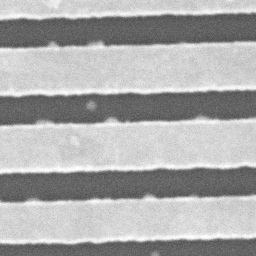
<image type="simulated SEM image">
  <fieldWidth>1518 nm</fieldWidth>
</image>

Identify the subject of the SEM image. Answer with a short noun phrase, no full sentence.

lines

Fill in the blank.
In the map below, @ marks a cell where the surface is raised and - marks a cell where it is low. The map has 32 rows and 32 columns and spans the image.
@@@@@@@@@@@@@@@@@@@@@@@@@@@@@@@@
@@@@@@@@@@@@@@@@@@@@@@@@@@@@@@--
--------------------------------
--------------------------------
--------------------------------
-------------------------@@@@@@@
@@@@@@@@@@@@@@@@@@@@@@@@@@@@@@@@
@@@@@@@@@@@@@@@@@@@@@@@@@@@@@@@@
@@@@@@@@@@@@@@@@@@@@@@@@@@@@@@@@
@@@@@@@@@@@@@@@@@@@@@@@@@@@@@@@@
@@@@@@@@@@@@@@@@@@@@@@@@@@@@@@@@
@@@@@@@@@@@@@@@@-@@@------------
--------------------------------
--------------------------------
--------------------------------
----------------@@@@@@@@@@@@@@@@
@@@@@@@@@@@@@@@@@@@@@@@@@@@@@@@@
@@@@@@@@@@@@@@@@@@@@@@@@@@@@@@@@
@@@@@@@@@@@@@@@@@@@@@@@@@@@@@@@@
@@@@@@@@@@@@@@@@@@@@@@@@@@@@@@@@
@@@@@@@@@@@@@@@@@@@@@@@@@@@@@@@@
@-------------------------------
--------------------------------
--------------------------------
--------------------------------
@@@@@@@@@@@@@@@@@@@@@@@@@@@@@@@@
@@@@@@@@@@@@@@@@@@@@@@@@@@@@@@@@
@@@@@@@@@@@@@@@@@@@@@@@@@@@@@@@@
@@@@@@@@@@@@@@@@@@@@@@@@@@@@@@@@
@@@@@@@@@@@@@@@@@@@@@@@@@@@@@@@@
--------------------------------
--------------------------------